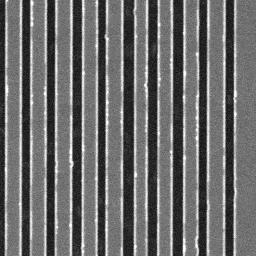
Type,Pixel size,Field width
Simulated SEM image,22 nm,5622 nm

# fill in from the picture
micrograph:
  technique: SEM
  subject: parallel lines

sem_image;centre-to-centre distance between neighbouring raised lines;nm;557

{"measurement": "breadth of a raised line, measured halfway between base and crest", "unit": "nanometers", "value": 351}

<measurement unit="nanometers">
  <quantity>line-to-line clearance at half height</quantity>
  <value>198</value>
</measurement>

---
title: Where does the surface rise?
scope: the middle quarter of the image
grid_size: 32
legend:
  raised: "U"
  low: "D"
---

UUDDDUUUDDDUUUUDDDUUUDDDUUUDDDUU
UUDDDUUUDDDUUUUDDDUUUDDDUUUDDDUU
UUDDDUUUDDDUUUUDDDUUUDDDUUUDDDUU
UUDDDUUUDDDUUUUDDDUUUDDDUUUDDDUU
UUDDDUUUDDDUUUUDDDUUUDDDUUUDDDUU
UUDDDUUUDDDUUUUDDDUUUDDDUUUDDDUU
UUDDDUUUDDDUUUUDDDUUUDDDUUUDDDUU
UUDDDUUUDDDUUUUDDDUUUDDDUUUDDDUU
UUDDDUUUDDDUUUUDDDUUUDDDUUUDDDUU
UUDDDUUUDDDUUUUDDDUUUDDDUUUDDDUU
UUDDDUUUDDDUUUUDDDUUUDDDUUUDDDUU
UUDDDUUUDDDUUUUDDDUUUDDDUUUDDDUU
UUDDDUUUDDDUUUUDDDUUUDDDUUUDDDUU
UUDDDUUUDDDUUUUDDDUUUDDDUUUDDDUU
UUDDDUUUDDDUUUUDDDUUUDDDUUUDDDUU
UUDDDUUUDDDUUUUDDDUUUDDDUUUDDDUU
UUDDDUUUDDDUUUUDDDUUUDDDUUUDDDUU
UUDDDUUUDDDUUUUDDDUUUDDDUUUDDDUU
UUDDDUUUDDDUUUUDDDUUUDDDUUUDDDUU
UUDDDUUUDDDUUUUDDDUUUDDDUUUDDDUU
UUDDDUUUDDDUUUUDDDUUUDDDUUUDDDUU
UUDDDUUUDDDUUUUDDDUUUDDDUUUDDDUU
UUDDDUUUDDDUUUUDDDUUUDDDUUUDDDUU
UUDDDUUUDDDUUUUDDDUUUDDDUUUDDDUU
UUDDDUUUDDDUUUUDDDUUUDDDUUUDDDUU
UUDDDUUUDDDUUUUDDDUUUDDDUUUDDDUU
UUDDDUUUDDDUUUUDDDUUUDDDUUUDDDUU
UUDDDUUUDDDUUUUDDDUUUDDDUUUDDDUU
UUDDDUUUDDDUUUUDDDUUUDDDUUUDDDUU
UUDDUUUUDDDUUUUDDDUUUDDDUUUDDDUU
UUDDDUUUDDDUUUUDDDUUUDDDUUUDDDUU
UUDDDUUUDDDUUUUDDDUUUDDDUUUDDDUU